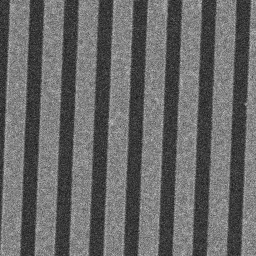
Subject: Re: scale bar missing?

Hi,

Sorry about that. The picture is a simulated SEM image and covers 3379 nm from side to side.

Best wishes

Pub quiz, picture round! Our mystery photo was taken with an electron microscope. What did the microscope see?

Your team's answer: parallel lines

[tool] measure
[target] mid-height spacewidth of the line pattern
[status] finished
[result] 206 nm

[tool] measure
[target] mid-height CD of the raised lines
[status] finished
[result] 19.1 px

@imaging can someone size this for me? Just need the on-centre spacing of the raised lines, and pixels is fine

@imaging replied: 34.4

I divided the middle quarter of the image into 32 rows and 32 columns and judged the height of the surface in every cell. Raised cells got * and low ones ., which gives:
...*****....*****....****....***
...*****....*****....****....***
...*****....****.....****....***
...*****....****.....****....***
...*****....****.....****....***
...*****....****....*****....***
...*****....****....*****....***
...*****....****....*****....***
...*****....****....*****....***
...*****....****....*****....***
...****.....****....*****....***
...****.....****....*****....***
...****.....****....*****....***
...****....*****....*****....***
...****....*****....****.....***
...****....*****....****.....***
...****....*****....****.....***
...****....*****....****....****
...****....*****....****....****
...****....*****....****....****
...****....*****....****....****
...****....*****....****....****
..*****....*****....****....****
..*****....*****....****....****
..*****....*****....****....****
..*****....*****....****....****
..*****....*****....****....****
..*****....*****....****....****
..*****....****.....****....****
..*****....****.....****....****
..*****....****....*****....****
..*****....****....*****....****